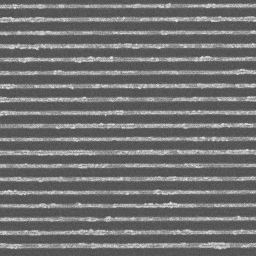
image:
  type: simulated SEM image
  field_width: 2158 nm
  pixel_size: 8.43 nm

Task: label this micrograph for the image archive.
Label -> parallel lines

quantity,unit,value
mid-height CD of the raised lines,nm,43.2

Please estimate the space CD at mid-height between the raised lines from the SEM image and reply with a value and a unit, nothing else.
72.7 nm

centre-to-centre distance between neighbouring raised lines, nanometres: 112